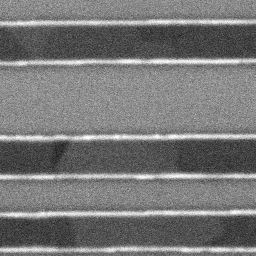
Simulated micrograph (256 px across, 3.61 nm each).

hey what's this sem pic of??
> lines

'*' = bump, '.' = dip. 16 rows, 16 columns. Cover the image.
................
****************
****************
****************
................
................
................
................
...........*****
****************
****************
................
................
****************
****************
****************